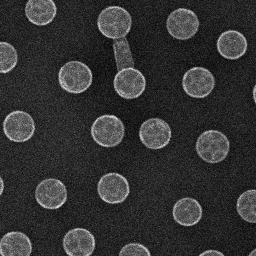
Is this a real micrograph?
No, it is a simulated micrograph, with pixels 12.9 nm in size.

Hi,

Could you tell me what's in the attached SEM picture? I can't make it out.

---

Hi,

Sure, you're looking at a regular array of raised bodies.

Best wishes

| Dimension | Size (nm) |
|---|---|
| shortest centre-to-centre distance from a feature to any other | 746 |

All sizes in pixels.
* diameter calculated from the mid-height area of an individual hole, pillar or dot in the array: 30.7